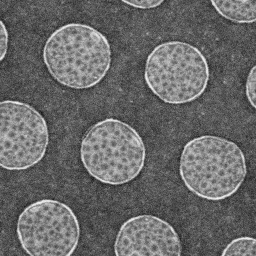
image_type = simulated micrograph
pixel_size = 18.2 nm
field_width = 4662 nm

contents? raised bodies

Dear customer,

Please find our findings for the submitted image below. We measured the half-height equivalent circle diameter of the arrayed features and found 1140 nm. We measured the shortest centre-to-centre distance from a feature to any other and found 1830 nanometres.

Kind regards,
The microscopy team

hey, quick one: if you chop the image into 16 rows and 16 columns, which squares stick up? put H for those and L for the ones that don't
LLLLLLLLLLLLLLHH
LLLLLLLLLLLLLLLL
LLLHHHHLLLLLLLLL
LLLHHHHLLHHHHLLL
LLLHHHHLLHHHHLLL
LLLLLLLLLLHHHLLH
HLLLLLLLLLLLLLLL
HHHLLLLLLLLLLLLL
HHHLLHHHHLLLLLLL
HHHLLHHHHLLHHHHL
LLLLLHHHHLLHHHHL
LLLLLLLLLLLLHHHL
LLLLLLLLLLLLLLLL
LHHHHLLLLLLLLLLL
LHHHHLLLHHHLLLLL
LLHHHLLHHHHLLLHH